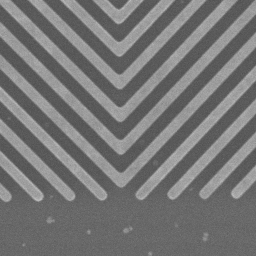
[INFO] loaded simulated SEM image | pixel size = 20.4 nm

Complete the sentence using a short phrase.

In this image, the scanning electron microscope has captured groups of lines, slits or small figures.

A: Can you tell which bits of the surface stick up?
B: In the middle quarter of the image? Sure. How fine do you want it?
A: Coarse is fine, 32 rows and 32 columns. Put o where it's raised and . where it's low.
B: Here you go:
ooo....oooo......ooo....oooo....
.ooo....oooo....ooo.....ooo....o
..ooo....oooo..ooo.....ooo....oo
...ooo....ooooooo.....ooo.....oo
....ooo.....oooo....oooo....oooo
.....ooo.....oo....oooo....oooo.
o.....ooo..........ooo....oooo..
oo.....ooo........ooo....oooo...
ooo.....ooo......ooo.....ooo....
.ooo.....ooo....ooo.....ooo....o
..ooo.....ooo..ooo.....ooo.....o
...ooo.....oooooo.....ooo.....oo
...oooo.....oooo.....ooo.....ooo
....oooo.....oo.....ooo.....ooo.
o.....ooo..........ooo.....ooo..
oo.....ooo........ooo.....ooo...
ooo.....ooo......ooo.....ooo....
.ooo.....ooo....ooo.....ooo.....
..ooo.....ooo..ooo.....ooo.....o
...ooo.....ooooooo....ooo.....oo
...oooo.....ooooo....ooo.....ooo
....oooo.....ooo....oooo....ooo.
o....oooo..........oooo....ooo..
oo....oooo........oooo....ooo...
ooo....oooo......oooo....oooo...
.ooo....oooo....oooo....oooo....
..ooo....oooo..oooo....oooo....o
...ooo....oooooooo....oooo....oo
...oooo....oooooo....oooo....ooo
....oooo....oooo....oooo....oooo
o....oooo.....o....oooo....oooo.
oo....oooo.........ooo....oooo..